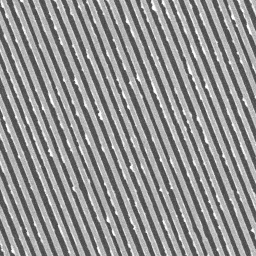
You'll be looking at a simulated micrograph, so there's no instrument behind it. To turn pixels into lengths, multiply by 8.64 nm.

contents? parallel lines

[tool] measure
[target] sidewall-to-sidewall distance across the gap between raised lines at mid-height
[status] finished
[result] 39.2 nm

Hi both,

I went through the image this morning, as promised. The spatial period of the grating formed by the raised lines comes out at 86.5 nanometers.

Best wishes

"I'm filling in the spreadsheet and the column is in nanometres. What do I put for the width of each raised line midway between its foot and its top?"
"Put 47.3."